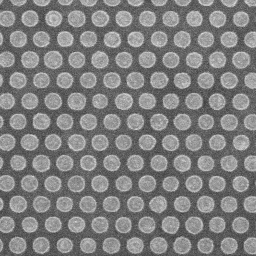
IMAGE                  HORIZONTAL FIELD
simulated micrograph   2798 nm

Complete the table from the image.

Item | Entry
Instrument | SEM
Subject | a regular array of raised bodies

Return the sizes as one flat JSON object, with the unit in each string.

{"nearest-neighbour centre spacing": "23.1 pixels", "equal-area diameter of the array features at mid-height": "173 nm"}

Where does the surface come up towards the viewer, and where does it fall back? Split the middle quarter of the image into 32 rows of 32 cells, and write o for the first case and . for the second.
..oo....oo....oo....oo....oo....
................................
o....oo....oo...ooo...ooo....o..
oo..oooo..oooo..oooo..oooo..ooo.
oo..oooo..oooo..oooo..oooo..ooo.
o....oo....oo...ooo...ooo...ooo.
................................
..oo................o...........
.oooo..oooo..oooo..oooo..ooo...o
.oooo..oooo..oooo..oooo..ooo...o
.oooo...oo...oooo..ooo...ooo...o
................................
................................
oo..oooo..oooo..oooo..oooo..ooo.
oo..oooo..oooo..oooo..oooo..ooo.
oo..oooo..oooo..oooo..ooo...ooo.
................................
................................
..ooo...oo...ooo...ooo...ooo...o
.oooo..oooo..oooo..oooo..ooo...o
.oooo..oooo..oooo..ooo...ooo...o
..oo....oo................o.....
................................
oo...oo....ooo..ooo...ooo...ooo.
oo..oooo..oooo..oooo..oooo.oooo.
oo..oooo..oooo..oooo..oooo.oooo.
o..........oo....o.....o.....oo.
................................
..oo....oo....oo....oo....o....o
.oooo..oooo..oooo..oooo..ooo...o
.oooo..oooo..oooo..oooo..ooo...o
..oo....oo....oo....oo....oo...o